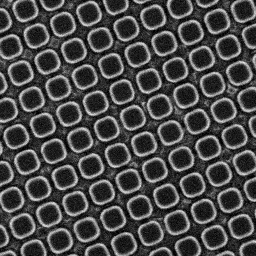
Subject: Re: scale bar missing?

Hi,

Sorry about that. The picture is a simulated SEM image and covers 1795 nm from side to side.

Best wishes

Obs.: a regular array of raised bodies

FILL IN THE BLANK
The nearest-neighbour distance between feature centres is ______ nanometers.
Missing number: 198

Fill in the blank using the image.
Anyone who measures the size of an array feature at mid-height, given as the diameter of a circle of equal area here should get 164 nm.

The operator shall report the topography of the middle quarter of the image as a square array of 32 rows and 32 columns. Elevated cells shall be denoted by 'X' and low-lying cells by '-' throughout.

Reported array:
-----X---XXXXXX--X-------XXXXXX-
---XXXX--XXXXXX------XX--XXXXXX-
--XXXXXX--XXXX-----XXXXX-XXXXXX-
--XXXXXX----------XXXXXX--XXXX--
X--XXXXX------XX--XXXXXX--------
X--XXXX-----XXXXX--XXXXX-----XXX
X-----------XXXXX--XXX------XXXX
X------XXX--XXXXX-----------XXXX
-----XXXXXX-XXXXX-----XXXX--XXXX
-----XXXXXX--XX------XXXXX--XXXX
XXX--XXXXXX----------XXXXXX--XX-
XXXX--XXXX-----XXXX--XXXXXX-----
XXXX---X------XXXXXX--XXXX-----X
XXXX------XX--XXXXXX---X------XX
XXX-----XXXXX--XXXXX------XX--XX
--------XXXXX--XXXX-----XXXXX--X
---XXX--XXXXXX----------XXXXX--X
--XXXX--XXXXX------XXX--XXXXXX--
-XXXXXX--XXX-----XXXXX--XXXXX---
-XXXXXX----------XXXXXX--XXX----
--XXXXX-----XXX--XXXXXX---------
--XXX------XXXXX--XXXXX-----XXX-
----------XXXXXX--XXX------XXXXX
-----XXXX--XXXXX----------XXXXXX
----XXXXX--XXXXX-----XXXX-XXXXXX
----XXXXXX--XX------XXXXX--XXXXX
XX--XXXXXX------X---XXXXXX--XX--
XXX-XXXXX-----XXXX--XXXXXX------
XXX----------XXXXXX--XXXX-----XX
XXX------XX--XXXXXX----------XXX
XX-----XXXXX--XXXXX------XX--XXX
------XXXXXX--XXXX-----XXXXX--XX